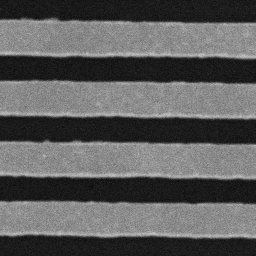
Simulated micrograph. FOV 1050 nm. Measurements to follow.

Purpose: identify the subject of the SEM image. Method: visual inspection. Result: lines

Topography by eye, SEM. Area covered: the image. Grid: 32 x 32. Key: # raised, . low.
................................
................................
................................
################################
################################
################################
################################
................................
................................
................................
############################....
################################
################################
################################
......##########################
................................
................................
................................
################################
################################
################################
################################
................................
................................
................................
###############################.
################################
################################
################################
............###......###########
................................
................................